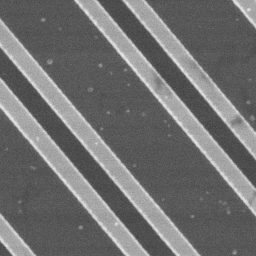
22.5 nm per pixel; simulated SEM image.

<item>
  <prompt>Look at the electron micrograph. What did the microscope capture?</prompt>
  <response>lines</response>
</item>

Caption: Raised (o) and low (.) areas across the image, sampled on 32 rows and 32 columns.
..........oo....oo...........ooo
...........oo....oo...........oo
...........ooo...ooo...........o
o...........ooo...ooo...........
oo...........ooo...ooo..........
ooo...........ooo...ooo.........
.oo............oo....oo.........
.ooo............oo....oo........
..ooo...........ooo...ooo.......
...ooo...........ooo...ooo......
o...ooo...........ooo...ooo.....
o....ooo...........ooo...ooo....
oo....ooo...........ooo...ooo...
ooo...ooo............oo....oo...
.ooo...ooo............oo...ooo..
..ooo...ooo...........ooo...ooo.
...ooo...ooo...........ooo...ooo
....ooo...ooo...........ooo...oo
....ooo....ooo...........ooo...o
.....ooo....oo............oo....
......ooo...ooo............oo...
.......ooo...ooo...........ooo..
........ooo...ooo...........ooo.
.........ooo...ooo...........ooo
.........ooo....ooo...........oo
..........ooo....ooo...........o
...........ooo...ooo............
o...........ooo...ooo...........
o............ooo...ooo..........
oo............ooo...ooo.........
ooo............oo....ooo........
.ooo...........ooo....ooo.......